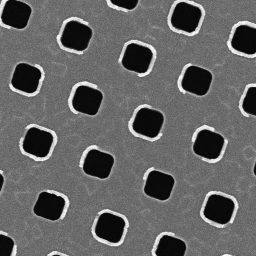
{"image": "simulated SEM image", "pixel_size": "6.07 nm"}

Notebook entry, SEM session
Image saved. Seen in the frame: a regular array of holes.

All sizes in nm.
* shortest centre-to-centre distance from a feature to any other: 390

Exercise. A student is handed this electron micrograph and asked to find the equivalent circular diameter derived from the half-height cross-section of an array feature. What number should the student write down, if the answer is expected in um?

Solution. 0.177